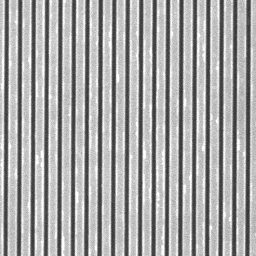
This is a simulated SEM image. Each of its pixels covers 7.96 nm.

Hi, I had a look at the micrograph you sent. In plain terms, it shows parallel lines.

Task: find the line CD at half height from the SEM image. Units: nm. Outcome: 69.6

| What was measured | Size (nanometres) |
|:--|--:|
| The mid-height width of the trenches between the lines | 38.8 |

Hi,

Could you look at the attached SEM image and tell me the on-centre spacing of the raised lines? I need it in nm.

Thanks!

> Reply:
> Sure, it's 107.